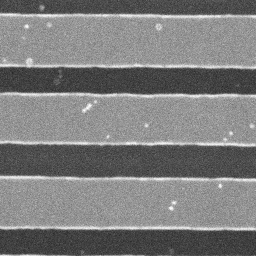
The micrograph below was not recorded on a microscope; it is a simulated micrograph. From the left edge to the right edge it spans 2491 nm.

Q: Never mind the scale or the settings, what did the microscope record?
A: lines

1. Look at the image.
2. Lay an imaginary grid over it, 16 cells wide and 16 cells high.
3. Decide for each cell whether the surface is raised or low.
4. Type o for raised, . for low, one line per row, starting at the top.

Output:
................
oooooooooooooooo
oooooooooooooooo
oooooooooooooooo
................
................
oooooooooooooooo
oooooooooooooooo
oooooooooooooooo
................
................
oooooooooooooooo
oooooooooooooooo
oooooooooooooooo
................
................